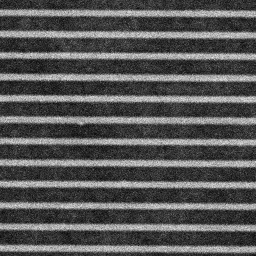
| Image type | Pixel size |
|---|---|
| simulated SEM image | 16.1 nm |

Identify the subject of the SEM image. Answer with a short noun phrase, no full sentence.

parallel lines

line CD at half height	86.7	nm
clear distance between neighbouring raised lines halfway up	262	nm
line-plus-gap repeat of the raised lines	345	nanometres